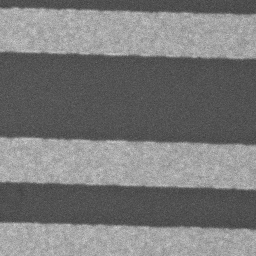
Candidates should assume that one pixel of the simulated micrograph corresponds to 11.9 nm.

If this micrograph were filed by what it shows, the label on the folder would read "lines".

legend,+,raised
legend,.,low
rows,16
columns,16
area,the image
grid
................
++++++++++++++++
++++++++++++++++
............++++
................
................
................
................
................
++++++++++++++++
++++++++++++++++
.......+++++++++
................
................
++++++++++++++++
++++++++++++++++